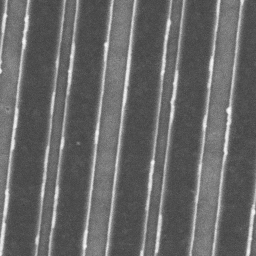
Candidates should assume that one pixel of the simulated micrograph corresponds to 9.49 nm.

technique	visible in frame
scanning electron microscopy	parallel lines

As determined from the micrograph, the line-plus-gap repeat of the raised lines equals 0.492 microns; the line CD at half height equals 347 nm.